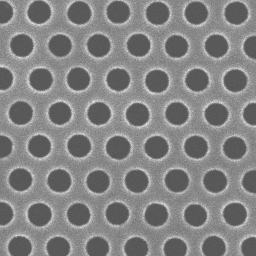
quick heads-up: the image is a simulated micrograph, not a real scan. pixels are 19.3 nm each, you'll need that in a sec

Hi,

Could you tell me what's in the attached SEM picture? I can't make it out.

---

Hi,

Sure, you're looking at a regular array of holes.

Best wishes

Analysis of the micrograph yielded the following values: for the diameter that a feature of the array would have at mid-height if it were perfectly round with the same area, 460 nm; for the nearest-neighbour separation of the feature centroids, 734 nm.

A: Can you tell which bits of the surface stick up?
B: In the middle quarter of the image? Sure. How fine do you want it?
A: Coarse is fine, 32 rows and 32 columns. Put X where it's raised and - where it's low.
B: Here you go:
XXXXXXXXXXXXXXXXXXXXXXXXXXXXXXXX
XX---XXXXXXX---XXXXXXX--XXXXXXXX
X-----XXXXX-----XXXXX-----XXXXX-
X------XXXX------XXX------XXXX--
X------XXXX------XXX------XXXX--
X-----XXXXX-----XXXX------XXXXX-
XX---XXXXXXX---XXXXXX----XXXXXXX
XXXXXXXXXXXXXXXXXXXXXXXXXXXXXXXX
XXXXXXXXXXXXXXXXXXXXXXXXXXXXXXXX
XXXXXXXX-XXXXXXXXXXXXXXXXXXX-XXX
-XXXXX-----XXXXX-----XXXXX----XX
--XXXX------XXX------XXXX------X
--XXXX------XXX-------XXX------X
--XXXX------XXX------XXXXX-----X
-XXXXXX----XXXXX-----XXXXX----XX
XXXXXXXX-XXXXXXXXX-XXXXXXXXXXXXX
XXXXXXXXXXXXXXXXXXXXXXXXXXXXXXXX
XXXXXXXXXXXXXXXXXXXXXXXXXXXXXXXX
XX----XXXXXX----XXXXX----XXXXXX-
X------XXXX-----XXXX------XXXX--
X------XXX-------XXX------XXXX--
X------XXX-------XXX------XXXX--
XX----XXXXX-----XXXXX-----XXXXX-
XXX-XXXXXXXX---XXXXXXX--XXXXXXXX
XXXXXXXXXXXXXXXXXXXXXXXXXXXXXXXX
XXXXXXXXXXXXXXXXXXXXXXXXXXXXXXXX
XXXXXXXX-XXXXXXXX--XXXXXXXX---XX
-XXXXX-----XXXXX-----XXXXX-----X
--XXXX-----XXXX------XXXX------X
--XXXX------XXX------XXXX------X
--XXXX-----XXXX------XXXX------X
-XXXXX-----XXXXX----XXXXXX----XX